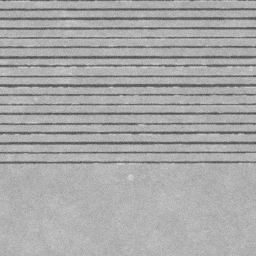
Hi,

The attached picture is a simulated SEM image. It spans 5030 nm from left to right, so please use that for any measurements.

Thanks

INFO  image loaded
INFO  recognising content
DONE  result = parallel lines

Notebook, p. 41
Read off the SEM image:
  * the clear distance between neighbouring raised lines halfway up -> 46.7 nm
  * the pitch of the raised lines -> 9.55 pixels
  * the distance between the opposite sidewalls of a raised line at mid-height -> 0.14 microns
